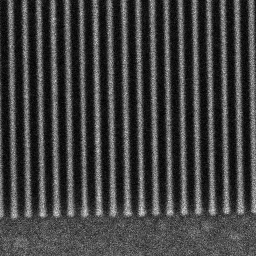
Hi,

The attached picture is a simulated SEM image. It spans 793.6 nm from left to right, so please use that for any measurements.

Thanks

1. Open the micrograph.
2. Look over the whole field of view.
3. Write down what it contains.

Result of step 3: parallel lines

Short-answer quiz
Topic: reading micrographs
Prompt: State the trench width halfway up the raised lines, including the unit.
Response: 26.7 nm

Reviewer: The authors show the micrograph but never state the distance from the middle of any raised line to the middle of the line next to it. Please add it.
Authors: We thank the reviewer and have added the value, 43.9 nanometers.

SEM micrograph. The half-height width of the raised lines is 17.8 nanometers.